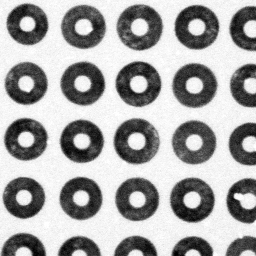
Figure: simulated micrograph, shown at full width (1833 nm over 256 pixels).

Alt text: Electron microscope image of a regular array of ring-shaped grooves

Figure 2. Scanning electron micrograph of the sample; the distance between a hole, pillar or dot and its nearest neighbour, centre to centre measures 400 nm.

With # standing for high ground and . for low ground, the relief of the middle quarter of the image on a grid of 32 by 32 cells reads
#.......#######.......########..
.........#####.........######...
..........###...........####....
...###....###....###....###.....
...####...###....####...###....#
...####...###....####...###....#
...###....###....####...###....#
.........#####..........####....
#........#####.........#####....
##......#######.......#######...
#################...##########..
################################
################################
################################
##.....########......##########.
#.......######........#######...
.........####..........#####....
..........###....##.....###.....
..####....##....####....###....#
..#####...##....####....###....#
...###....##....####....###....#
.........####..........####.....
.........####..........#####....
#.......######........#######...
###...##########....##########..
################################
################################
################################
###...############.############.
#.......#######.......######....
.........#####.........####.....
.........####..........####.....